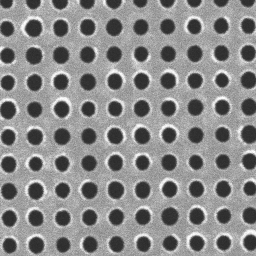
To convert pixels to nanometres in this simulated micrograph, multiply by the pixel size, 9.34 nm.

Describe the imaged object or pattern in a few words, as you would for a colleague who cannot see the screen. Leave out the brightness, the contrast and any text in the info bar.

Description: a regular array of holes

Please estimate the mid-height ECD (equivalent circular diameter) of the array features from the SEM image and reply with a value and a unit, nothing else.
153 nanometers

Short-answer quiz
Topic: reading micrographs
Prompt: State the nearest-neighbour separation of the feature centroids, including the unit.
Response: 0.249 µm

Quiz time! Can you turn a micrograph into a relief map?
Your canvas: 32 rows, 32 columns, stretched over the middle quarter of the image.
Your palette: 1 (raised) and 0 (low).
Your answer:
11111111111111111111111111111111
11111111111111111111111111111111
11111001111100111100111110011111
01110000111000111000011100001110
01110000111000011000011100001110
01110000111000111100011100001110
11111001111111111110111111111111
11111111111111111111111111111111
11111111111111111111111111111111
11111001111100111100011110001110
01111000111000011100001100001110
00110000111000011000001100001110
01111000111000111100011110001111
11111111111111111111111111111111
11111111111111111111111111111111
11111111111111111111111111111111
01111001111000111100011110001111
00110000111000011000001100001110
00110000111000011100001110001110
01111000111000111100011110011111
11111111111111111111111111111111
11111111111111111111111111111111
11111111111111111111111111111111
01111000111000011100011110001110
01110000111000011100011100001110
01110000111000011100011100001110
01111001111100111110111110011111
11111111111111111111111111111111
11111111111111111111111111111111
11111101111100111110011110011111
01110000111000011100001110001110
00110000011000011100001100000110